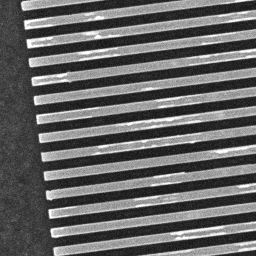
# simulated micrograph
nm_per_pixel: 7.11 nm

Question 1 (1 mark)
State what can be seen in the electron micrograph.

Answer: parallel lines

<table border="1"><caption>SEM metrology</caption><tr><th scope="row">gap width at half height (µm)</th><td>0.0705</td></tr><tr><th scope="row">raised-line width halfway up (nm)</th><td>63.5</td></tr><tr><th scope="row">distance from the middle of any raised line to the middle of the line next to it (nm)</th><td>135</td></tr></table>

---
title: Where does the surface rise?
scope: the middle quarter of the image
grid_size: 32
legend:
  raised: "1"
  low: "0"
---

00000000000000011111111111111100
00000000111111111111110000000000
11111111111111000000000000000000
11111110000000000000000000000111
00000000000000000000011111111111
00000000000000111111111111111100
00000011111111111111110000000000
11111111111111000000000000000000
11111110000000000000000000011111
00000000000000000001111111111111
00000000000011111111111111110000
00001111111111111111000000000000
11111111111100000000000000000000
11111000000000000000000001111111
00000000000000000111111111111111
00000000001111111111111111000000
00111111111111111100000000000000
11111111110000000000000000000000
11100000000000000000000001111111
00000000000000000111111111111111
00000000001111111111111100000000
00111111111111110000000000000000
11111111100000000000000000000001
10000000000000000000000111111111
00000000000000001111111111111100
00000000111111111111110000000000
11111111111111000000000000000000
11111110000000000000000000011111
00000000000000000001111111111111
00000000000000111111111111111100
00000011111111111111110000000000
11111111111111000000000000000000